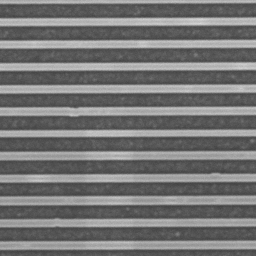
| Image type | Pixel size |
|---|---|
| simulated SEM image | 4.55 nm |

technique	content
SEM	parallel lines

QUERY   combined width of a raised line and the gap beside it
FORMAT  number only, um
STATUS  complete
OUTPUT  0.102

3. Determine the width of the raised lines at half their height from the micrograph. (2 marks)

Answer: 7.76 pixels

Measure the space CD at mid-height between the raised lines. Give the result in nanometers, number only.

67.8